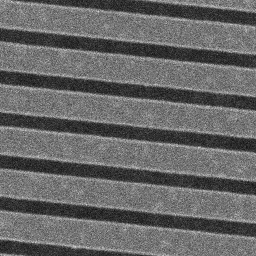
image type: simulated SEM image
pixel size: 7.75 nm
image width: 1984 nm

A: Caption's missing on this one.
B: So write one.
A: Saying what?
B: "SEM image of parallel lines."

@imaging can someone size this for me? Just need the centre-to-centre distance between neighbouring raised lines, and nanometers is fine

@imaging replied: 326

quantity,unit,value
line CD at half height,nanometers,211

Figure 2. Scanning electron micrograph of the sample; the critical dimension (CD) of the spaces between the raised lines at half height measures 119 nm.